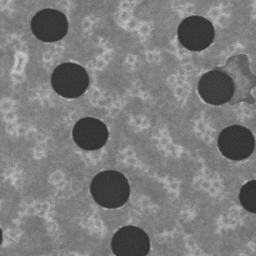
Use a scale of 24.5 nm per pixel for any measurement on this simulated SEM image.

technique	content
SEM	holes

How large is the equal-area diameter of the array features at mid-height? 906 nanometers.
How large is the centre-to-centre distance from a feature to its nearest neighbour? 1.43 microns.